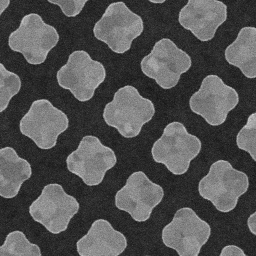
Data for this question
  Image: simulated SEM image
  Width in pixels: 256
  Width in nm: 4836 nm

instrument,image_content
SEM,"a regular array of raised bodies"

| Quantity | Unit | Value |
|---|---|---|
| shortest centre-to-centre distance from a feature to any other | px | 60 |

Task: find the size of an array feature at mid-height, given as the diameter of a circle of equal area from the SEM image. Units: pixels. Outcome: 44.2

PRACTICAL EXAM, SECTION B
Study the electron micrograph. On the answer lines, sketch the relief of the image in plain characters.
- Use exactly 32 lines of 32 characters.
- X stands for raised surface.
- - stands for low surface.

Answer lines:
X------XXXX---X--------XXXXX----
--------XX---XXX-------XXXXX----
---XX--------XXXXX----XXXXXX----
--XXXXX-----XXXXXX-----XXXX-----
-XXXXXX-----XXXXX--------XX---XX
-XXXXXX------XXX----XX-------XXX
--XXXX---XX--------XXXX-----XXXX
---XXX---XXX------XXXXXX----XXXX
X-------XXXXX-----XXXXXX------XX
XX-----XXXXXX------XXX----X----X
XX------XXXX--------XX---XXX----
XX-------XXX---XX--------XXXX---
X---------X---XXXX------XXXXXX--
X---XXX------XXXXXX-----XXXXX---
---XXXXX-----XXXXXX------XXX---X
---XXXXX------XXXX---XX---X----X
---XXXXX-------XX----XX-------XX
----XXX---XX--------XXXXX-----XX
-----X----XXXX-----XXXXXX-----XX
XX-------XXXXX-----XXXXX-------X
XXXX----XXXXXX-------XXX---XX---
XXXX-----XXXX---------X---XXXX--
XXX-------XXX---XXX------XXXXXX-
XX----XX-------XXXXX-----XXXXXX-
XX---XXXX------XXXXX-----XXXXX--
----XXXXXX-----XXXXX-------XX---
----XXXXXX------XXX---XX--------
-----XXXX--------X----XXX------X
------XX---XXX-------XXXXX-----X
-XX--------XXXX-----XXXXXX------
XXXX------XXXXXX-----XXXX-------
XXXXX-----XXXXX-------XXX---XX--